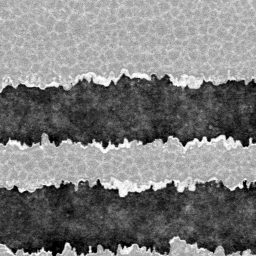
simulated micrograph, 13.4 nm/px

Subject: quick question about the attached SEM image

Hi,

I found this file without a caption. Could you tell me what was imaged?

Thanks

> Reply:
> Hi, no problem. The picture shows one or a few lines or trenches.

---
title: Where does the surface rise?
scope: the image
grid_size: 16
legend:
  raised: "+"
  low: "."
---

++++++++++++++++
++++++++++++++++
++++++++++++++++
++++++++++++++++
++++++++++++++++
................
................
................
................
++++++++++++++++
++++++++++++++++
++++...+++....+.
................
................
................
........+..++...